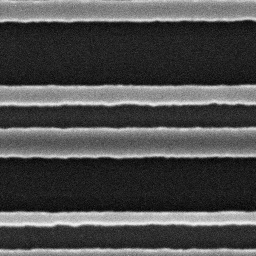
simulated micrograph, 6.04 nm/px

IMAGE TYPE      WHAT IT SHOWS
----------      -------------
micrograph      lines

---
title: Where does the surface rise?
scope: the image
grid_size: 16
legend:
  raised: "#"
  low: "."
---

################
................
................
................
................
################
################
################
################
################
................
................
................
################
################
################